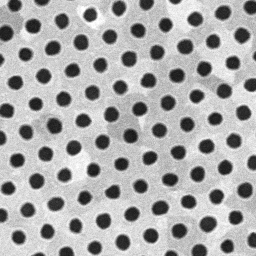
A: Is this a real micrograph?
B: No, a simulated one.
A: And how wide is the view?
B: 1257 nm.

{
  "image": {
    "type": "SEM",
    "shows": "a regular array of holes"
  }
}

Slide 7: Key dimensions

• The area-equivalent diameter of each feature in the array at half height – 79 nm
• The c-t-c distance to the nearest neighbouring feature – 0.14 µm